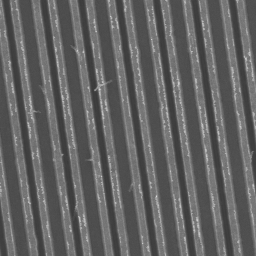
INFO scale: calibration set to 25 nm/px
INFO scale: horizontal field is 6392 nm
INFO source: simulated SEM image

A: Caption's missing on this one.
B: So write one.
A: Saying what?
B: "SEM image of parallel lines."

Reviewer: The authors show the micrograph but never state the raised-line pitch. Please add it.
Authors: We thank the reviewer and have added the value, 465 nm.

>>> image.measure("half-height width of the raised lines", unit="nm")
219